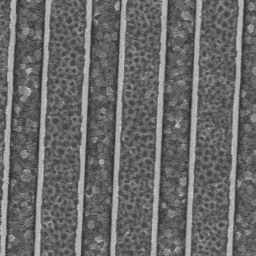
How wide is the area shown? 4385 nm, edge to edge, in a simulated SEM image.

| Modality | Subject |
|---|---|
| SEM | one or a few lines or trenches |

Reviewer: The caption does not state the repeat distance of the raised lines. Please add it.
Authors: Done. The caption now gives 1.29 micrometres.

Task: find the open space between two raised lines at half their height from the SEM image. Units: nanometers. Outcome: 590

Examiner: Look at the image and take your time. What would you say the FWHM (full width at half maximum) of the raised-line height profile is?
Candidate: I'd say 0.706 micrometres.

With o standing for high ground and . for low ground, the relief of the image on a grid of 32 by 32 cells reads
oo....ooooo.....ooooo....ooooo..
oo....ooooo....oooooo....ooooo..
oo....ooooo....ooooo.....ooooo..
oo....ooooo....ooooo.....ooooo..
oo....ooooo....ooooo.....ooooo..
oo....ooooo....ooooo.....ooooo..
o.....ooooo....ooooo.....ooooo..
o.....ooooo....ooooo.....ooooo..
o.....ooooo....ooooo.....ooooo..
o.....ooooo....ooooo....oooooo..
o.....ooooo....ooooo....oooooo..
o.....ooooo....ooooo....oooooo..
o.....ooooo....ooooo....oooooo..
o....oooooo....ooooo....ooooo...
o....ooooo.....ooooo....ooooo...
o....ooooo.....ooooo....ooooo...
o....ooooo.....ooooo....ooooo...
o....ooooo.....ooooo....ooooo...
o....ooooo.....ooooo....ooooo...
o....ooooo.....ooooo....ooooo...
o....ooooo.....ooooo....ooooo...
o....ooooo.....ooooo....ooooo...
o....ooooo.....ooooo....ooooo...
o....ooooo....oooooo....ooooo...
o....ooooo....oooooo....ooooo...
o....ooooo....ooooo.....ooooo...
.....ooooo....ooooo.....ooooo...
.....ooooo....ooooo.....ooooo...
.....ooooo....ooooo.....ooooo...
.....ooooo....ooooo.....ooooo...
.....ooooo....ooooo.....ooooo...
.....ooooo....ooooo.....ooooo...